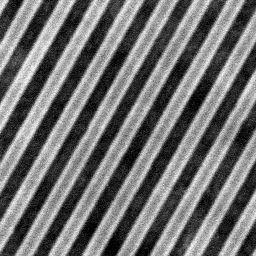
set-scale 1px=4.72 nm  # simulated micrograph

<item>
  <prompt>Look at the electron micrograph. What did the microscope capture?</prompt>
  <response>parallel lines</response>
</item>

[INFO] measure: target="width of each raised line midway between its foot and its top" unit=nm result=66.7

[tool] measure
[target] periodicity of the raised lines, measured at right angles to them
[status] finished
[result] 139 nanometres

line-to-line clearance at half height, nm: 71.3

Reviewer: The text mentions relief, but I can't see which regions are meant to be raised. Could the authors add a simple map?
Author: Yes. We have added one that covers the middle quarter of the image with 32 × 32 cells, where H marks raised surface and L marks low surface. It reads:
HHLLLLHHHHLLLLLHHHHLLLLHHHHLLLLL
HLLLLLHHHHLLLLHHHHLLLLLHHHHLLLLH
HLLLLHHHHLLLLLHHHHLLLLHHHHLLLLHH
LLLLLHHHHLLLLHHHHLLLLLHHHLLLLLHH
LLLLHHHHLLLLLHHHHLLLLHHHHLLLLHHH
LLLLHHHHLLLLHHHHLLLLHHHHLLLLLHHH
LLLHHHHLLLLHHHHLLLLLHHHHLLLLHHHH
LLHHHHLLLLLHHHHLLLLHHHHLLLLLHHHH
LLHHHHLLLLHHHHLLLLLHHHHLLLLHHHHL
LHHHHLLLLLHHHHLLLLHHHHLLLLHHHHLL
LHHHHLLLLHHHHLLLLLHHHLLLLLHHHHLL
HHHHLLLLLHHHHLLLLHHHHLLLLHHHHLLL
HHHHLLLLHHHHLLLLHHHHLLLLLHHHHLLL
HHHLLLLHHHHLLLLLHHHHLLLLHHHHLLLL
HHLLLLLHHHHLLLLHHHHLLLLLHHHHLLLL
HHLLLLHHHHLLLLLHHHHLLLLHHHHLLLLL
HLLLLLHHHHLLLLHHHHLLLLLHHHLLLLLH
HLLLLHHHHLLLLLHHHHLLLLHHHHLLLLLH
LLLLLHHHHLLLLHHHHLLLLLHHHLLLLLHH
LLLLHHHHLLLLHHHHLLLLLHHHHLLLLHHH
LLLHHHHLLLLLHHHHLLLLLHHHLLLLLHHH
LLLHHHHLLLLHHHHLLLLLHHHHLLLLHHHH
LLHHHHLLLLLHHHHLLLLHHHHLLLLLHHHH
LLHHHHLLLLHHHHLLLLLHHHLLLLLHHHHL
LHHHHLLLLLHHHHLLLLHHHHLLLLLHHHHL
LHHHHLLLLHHHHLLLLHHHHLLLLLHHHHLL
HHHHLLLLHHHHLLLLLHHHHLLLLHHHHLLL
HHHHLLLLHHHHLLLLHHHHLLLLLHHHHLLL
HHHLLLLHHHHLLLLLHHHHLLLLHHHHLLLL
HHHLLLLHHHHLLLLHHHHLLLLLHHHHLLLL
HHLLLLHHHHLLLLLHHHHLLLLHHHHLLLLL
HLLLLLHHHHLLLLHHHHLLLLLHHHHLLLLH